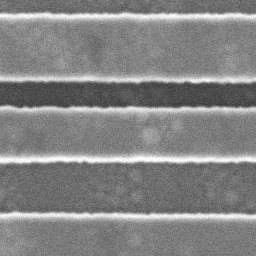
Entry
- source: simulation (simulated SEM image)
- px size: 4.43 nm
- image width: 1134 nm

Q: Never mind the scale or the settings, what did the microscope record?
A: lines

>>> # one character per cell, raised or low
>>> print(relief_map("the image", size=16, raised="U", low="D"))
DDDDDDDDDDDDDDDD
UUUUUUUUUUUUUUUU
UUUUUUUUUUUUUUUU
UUUUUUUUUUUUUUUU
UUUUUUUUUUUUUUUU
DDDDDDDDDDDDDDDD
DDDDDDDDDDDDDDDD
UUUUUUUUUUUUUUUU
UUUUUUUUUUUUUUUU
UUUUUUUUUUUUUUUU
DDDDDDDDDDDDDDDD
DDDDDDDDDDDDDDDD
DDDDDDDDDDDDDDDD
UUUUUUUUUUUUUUUD
UUUUUUUUUUUUUUUU
UUUUUUUUUUUUUUUU